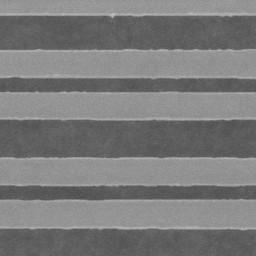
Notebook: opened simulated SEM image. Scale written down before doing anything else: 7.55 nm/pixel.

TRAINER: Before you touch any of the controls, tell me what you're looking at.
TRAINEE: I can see lines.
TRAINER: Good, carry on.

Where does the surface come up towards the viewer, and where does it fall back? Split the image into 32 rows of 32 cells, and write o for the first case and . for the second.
oooooooooooooooooooooooooooooooo
oooooooooooooooooooooooooooooooo
................................
................................
................................
................................
oooooooooooooooooooooooooooooooo
oooooooooooooooooooooooooooooooo
oooooooooooooooooooooooooooooooo
oooooooooooooooooooooooooooooooo
................................
................................
oooooooooooooooooooooooooooooooo
oooooooooooooooooooooooooooooooo
oooooooooooooooooooooooooooooooo
................................
................................
................................
................................
................................
oooooooooooooooooooooooooooooooo
oooooooooooooooooooooooooooooooo
oooooooooooooooooooooooooooooooo
................................
................................
oooooooooooooooooooooooooooooooo
oooooooooooooooooooooooooooooooo
oooooooooooooooooooooooooooooooo
........o.............oo.ooooooo
................................
................................
................................